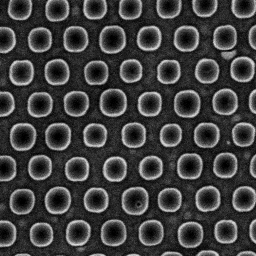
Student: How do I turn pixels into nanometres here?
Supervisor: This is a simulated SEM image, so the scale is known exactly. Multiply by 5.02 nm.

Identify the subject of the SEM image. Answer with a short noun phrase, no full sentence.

a regular array of raised bodies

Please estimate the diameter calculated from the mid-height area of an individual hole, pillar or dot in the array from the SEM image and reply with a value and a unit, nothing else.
24.7 pixels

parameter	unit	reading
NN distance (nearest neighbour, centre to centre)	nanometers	178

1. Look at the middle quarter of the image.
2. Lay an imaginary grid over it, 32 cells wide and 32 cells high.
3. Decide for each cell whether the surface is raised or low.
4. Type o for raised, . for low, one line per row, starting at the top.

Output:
o.....ooooo...ooooo.....ooooo...
o....oooooo...oooooo....ooooo...
o....oooooo...ooooo.....ooooo...
o....oooooo...ooooo.....ooooo...
......oooo..............oooo....
................................
...........ooo..................
.oooo.....ooooo.....oooo....oooo
oooooo...oooooo....ooooo....oooo
oooooo...ooooooo...ooooo....oooo
oooooo...ooooooo...ooooo....oooo
oooooo...oooooo....ooooo....oooo
.oooo......ooo......ooo.....oooo
................................
................................
o.....oooo.....ooooo.....ooo....
o....ooooo.....ooooo.....oooo...
oo...oooooo....ooooo....ooooo...
oo...oooooo....ooooo....ooooo...
o....ooooo.....ooooo.....oooo...
o......oo.......ooo.............
................................
................................
..oo........oo......ooo......ooo
.ooooo....ooooo....ooooo.....ooo
.ooooo....ooooo....ooooo....oooo
.ooooo....ooooo....ooooo....oooo
.ooooo....ooooo....ooooo.....ooo
.oooo......oooo.....ooo.......oo
................................
................................
o.....oooo......oooo.....ooo....